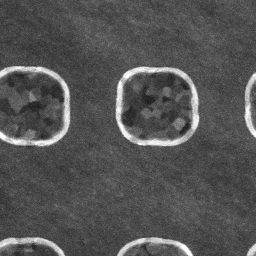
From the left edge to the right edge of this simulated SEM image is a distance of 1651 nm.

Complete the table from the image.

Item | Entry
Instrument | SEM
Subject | raised bodies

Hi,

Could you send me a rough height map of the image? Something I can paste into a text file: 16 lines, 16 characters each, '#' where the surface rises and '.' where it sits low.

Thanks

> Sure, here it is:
................
................
................
................
###.....###.....
####....####....
####...#####...#
####...#####...#
####....####....
................
................
................
................
................
................
####....####....